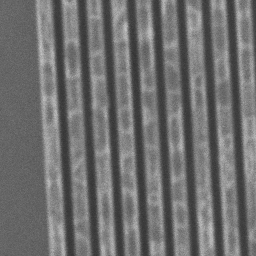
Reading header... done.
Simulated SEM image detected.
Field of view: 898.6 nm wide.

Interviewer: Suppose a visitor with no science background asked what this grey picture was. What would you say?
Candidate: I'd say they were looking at parallel lines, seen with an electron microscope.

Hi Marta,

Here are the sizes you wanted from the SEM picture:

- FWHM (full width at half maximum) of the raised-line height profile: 52.1 nanometres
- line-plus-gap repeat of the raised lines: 86.9 nm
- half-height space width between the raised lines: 32.4 nm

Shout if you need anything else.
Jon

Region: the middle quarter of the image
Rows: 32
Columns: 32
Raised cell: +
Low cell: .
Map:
++++...+++...+++...+++...++++...
.+++...+++...++++..++++..++++...
.+++...+++...++++..++++..++++...
.+++...+++...+++...++++..++++...
.+++...+++...++++..++++..++++...
.+++...++++..++++..++++...+++...
.+++...++++..++++..++++...+++...
.+++...++++..++++..++++...+++...
.+++...++++..++++..++++...+++...
.+++...++++..++++...+++...+++...
.++++..++++..++++...+++...+++...
.++++..++++..++++...+++...+++...
.++++..++++..++++...+++...+++...
.++++..++++..++++...+++...+++...
.++++...+++...+++...+++...++++..
.++++...+++...+++...+++...++++..
.++++...+++...+++...+++...++++..
.++++...+++...+++...+++...++++..
.++++...+++...+++...+++...++++..
..+++...+++...+++...++++..++++..
..+++...+++...+++...++++..++++..
..+++...+++...+++...++++..++++..
..+++...+++...+++...++++..++++..
..+++...++++..++++..++++...+++..
..+++...++++..++++..++++...+++..
..+++...++++..++++..++++...+++..
..+++...++++..++++..++++...+++..
..+++...++++..++++...+++...+++..
..++++..++++..++++...+++...+++..
..++++..++++..++++...+++...+++..
..++++..++++..++++...+++...+++..
..++++..++++..++++...+++...+++..